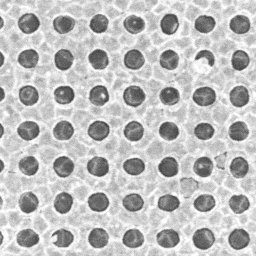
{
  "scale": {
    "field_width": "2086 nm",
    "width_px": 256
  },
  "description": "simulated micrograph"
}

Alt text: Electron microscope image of a regular array of holes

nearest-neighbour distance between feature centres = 283 nanometers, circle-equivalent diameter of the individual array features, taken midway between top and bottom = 170 nm